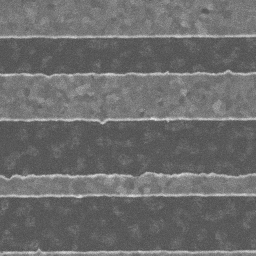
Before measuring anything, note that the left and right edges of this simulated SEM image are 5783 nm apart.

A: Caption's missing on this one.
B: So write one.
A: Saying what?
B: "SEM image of one or a few lines or trenches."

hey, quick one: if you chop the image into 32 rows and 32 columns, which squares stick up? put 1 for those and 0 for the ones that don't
11111111111111111111111111111111
11111111111111111111111111111111
11111111111111111111111111111111
11111111111111111111111111111111
11111111111111111111001000111100
00000000000000000000000000000000
00000000000000000000000000000000
00000000000000000000000000000000
00000000000000000000000000000000
11111111111111111111111111111111
11111111111111111111111111111111
11111111111111111111111111111111
11111111111111111111111111111111
11111111111111111111111111111111
11111111111111111111111111111111
00000000000000000000000000000000
00000000000000000000000000000000
00000000000000000000000000000000
00000000000000000000000000000000
00000000000000000000000000000000
00000000000000000000000000000000
00000000000000000000000000000000
11111111111111111111111111111111
11111111111111111111111111111111
00111001011000000000000000000000
00000000000000000000000000000000
00000000000000000000000000000000
00000000000000000000000000000000
00000000000000000000000000000000
00000000000000000000000000000000
00000000000000000000000000000000
00001000000010110001100001111111